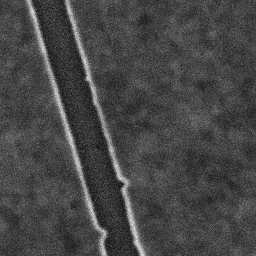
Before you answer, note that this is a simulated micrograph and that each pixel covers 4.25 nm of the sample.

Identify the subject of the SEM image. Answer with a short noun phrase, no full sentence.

one or a few lines or trenches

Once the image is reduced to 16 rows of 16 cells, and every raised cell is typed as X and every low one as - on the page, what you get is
XX--XXXXXXXXXXXX
XX---XXXXXXXXXXX
XXX--XXXXXXXXXXX
XXX--XXXXXXXXXXX
XXX--XXXXXXXXXXX
XXX---XXXXXXXXXX
XXXX--XXXXXXXXXX
XXXX--XXXXXXXXXX
XXXX---XXXXXXXXX
XXXXX--XXXXXXXXX
XXXXX--XXXXXXXXX
XXXXX---XXXXXXXX
XXXXXX--XXXXXXXX
XXXXXX--XXXXXXXX
XXXXXX--XXXXXXXX
XXXXXX---XXXXXXX